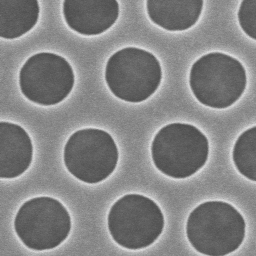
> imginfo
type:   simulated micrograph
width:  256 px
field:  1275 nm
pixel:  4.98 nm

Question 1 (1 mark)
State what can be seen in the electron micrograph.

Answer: holes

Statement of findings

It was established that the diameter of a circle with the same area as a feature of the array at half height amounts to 278 nanometres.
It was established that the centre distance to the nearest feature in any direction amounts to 0.398 micrometres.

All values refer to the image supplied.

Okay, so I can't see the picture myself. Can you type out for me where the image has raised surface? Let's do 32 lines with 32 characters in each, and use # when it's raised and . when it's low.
.....###.......###.......#####..
.....###.......###.......#####..
.....###.......####......#####..
....#####.....######....######..
...############################.
################################
#####.########.....#############
###.....######......#####.....##
###......####.......####.......#
##.......####.......####.......#
##.......####.......####.......#
###......#####.....#####......##
####....#######...#######.....##
###########################.####
################################
..###################..#########
...######....#######.....#####..
....####......#####.......####..
....####.......####.......###...
....####.......####.......###...
....####.......####.......###...
...######.....######.....#####..
##########...##################.
################################
###############...##############
###.....######......#####....###
##.......#####......####......##
##.......####.......###........#
##.......#####......###........#
##......######......###........#
###....########....#####......##
#########################....###